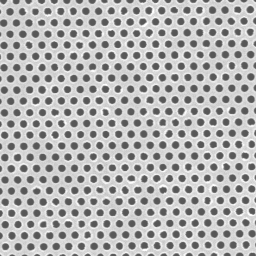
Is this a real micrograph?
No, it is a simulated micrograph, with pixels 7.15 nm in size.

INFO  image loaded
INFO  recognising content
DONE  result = a regular array of holes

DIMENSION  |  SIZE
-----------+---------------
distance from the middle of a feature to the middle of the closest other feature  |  87.8 nanometres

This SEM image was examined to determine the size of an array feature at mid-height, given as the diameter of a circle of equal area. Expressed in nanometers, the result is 51.7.